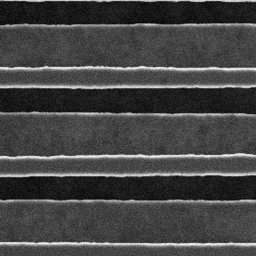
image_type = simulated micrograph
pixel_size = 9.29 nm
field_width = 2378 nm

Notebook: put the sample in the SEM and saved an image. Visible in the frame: lines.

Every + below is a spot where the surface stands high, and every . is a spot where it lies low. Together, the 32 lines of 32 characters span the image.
................................
................................
................................
++++++++++++++++++++++++++++++++
++++++++++++++++++++++++++++++++
++++++++++++++++++++++++++++++++
++++++++++++++++++++++++++++++++
++++++++++++++++++++++++++++++++
++++++++++++++++++++++++++++++++
++++++++++++++++++++++++++++++++
++++++++++++++++++++++++++++++++
................................
................................
................................
++++++++++++++++++++++++++++++++
++++++++++++++++++++++++++++++++
++++++++++++++++++++++++++++++++
++++++++++++++++++++++++++++++++
++++++++++++++++++++++++++++++++
++++++++++++++++++++++++++++++++
++++++++++++++++++++++++++++++++
++++++++++++++++++++++++++++++++
................................
................................
................................
++++++++++++++++++++++++++++++++
++++++++++++++++++++++++++++++++
++++++++++++++++++++++++++++++++
++++++++++++++++++++++++++++++++
++++++++++++++++++++++++++++++++
++++++++++++++++++++++++++++++++
++++++++++++++++++++++++++++++++